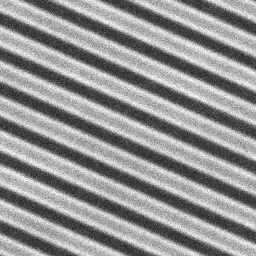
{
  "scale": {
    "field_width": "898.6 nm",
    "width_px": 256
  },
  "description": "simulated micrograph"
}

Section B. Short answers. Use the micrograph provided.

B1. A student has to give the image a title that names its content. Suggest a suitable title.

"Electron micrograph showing parallel lines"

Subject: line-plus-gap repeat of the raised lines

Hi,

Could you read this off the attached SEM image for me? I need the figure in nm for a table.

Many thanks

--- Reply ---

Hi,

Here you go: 111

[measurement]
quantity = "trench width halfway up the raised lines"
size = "57.7 nanometres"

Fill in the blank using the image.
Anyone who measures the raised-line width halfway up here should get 15.6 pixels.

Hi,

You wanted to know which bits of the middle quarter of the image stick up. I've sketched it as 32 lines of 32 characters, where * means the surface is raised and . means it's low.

*****..........**********.......
*******...........*********.....
.*********..........*********...
...*********..........*********.
.....*********..........********
.......*********...........*****
..........********...........***
*...........*********..........*
***...........*********.........
******..........*********.......
********...........********.....
.*********...........*********..
...*********...........*********
......********...........*******
........*********...........****
..........*********...........**
**..........*********...........
****...........********.........
*******..........*********......
*********..........*********....
..*********..........*********..
....*********...........********
.......********...........******
.........*********..........****
*..........*********..........**
***..........*********..........
*****...........********........
********..........*********.....
**********..........*********...
...*********..........*********.
.....*********..........********
.......*********...........*****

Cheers